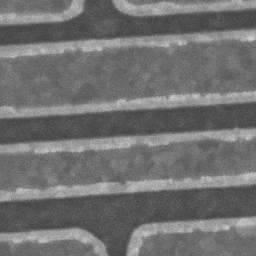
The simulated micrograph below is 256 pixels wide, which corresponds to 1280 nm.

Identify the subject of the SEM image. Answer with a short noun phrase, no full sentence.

one or a few lines or trenches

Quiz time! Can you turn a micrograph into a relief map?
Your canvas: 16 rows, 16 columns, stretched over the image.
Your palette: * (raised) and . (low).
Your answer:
*****...*****...
................
..........******
****************
****************
****************
*********.......
................
.............***
****************
****************
************....
................
................
.........*******
******..********